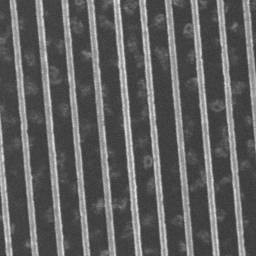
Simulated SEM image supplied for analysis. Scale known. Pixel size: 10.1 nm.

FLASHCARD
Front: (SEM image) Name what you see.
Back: parallel lines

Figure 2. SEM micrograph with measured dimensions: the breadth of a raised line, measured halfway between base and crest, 45.3 nm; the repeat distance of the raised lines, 261 nm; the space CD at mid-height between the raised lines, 215 nm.